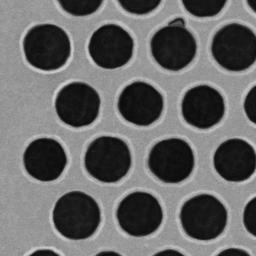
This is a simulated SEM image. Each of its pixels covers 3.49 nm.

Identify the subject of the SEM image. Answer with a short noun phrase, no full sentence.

a regular array of holes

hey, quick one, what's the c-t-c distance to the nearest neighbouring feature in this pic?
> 218 nm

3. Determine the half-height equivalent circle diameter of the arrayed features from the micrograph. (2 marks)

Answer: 153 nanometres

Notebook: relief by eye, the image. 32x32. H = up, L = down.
HHHHHHHHLLLLHHHLLLLLHHHLLLLLHHHL
HHHHHHHHHLLLHHHHHLHHHHHHLLLHHHHH
HHHHHHHHHHHHHHHHHHHHHHHHHHHHHHHH
HHHHLLLHHHHHHLLHHHHHLLLHHHHHLLLH
HHHLLLLLHHHLLLLLHHHLLLLLHHHLLLLL
HHHLLLLLLHHLLLLLLHHLLLLLHHHLLLLL
HHHLLLLLLHHLLLLLHHHLLLLLHHHLLLLL
HHHHLLLLHHHHLLLLHHHHLLLLHHHLLLLL
HHHHHLLHHHHHHLHHHHHHHLLHHHHHLLLH
HHHHHHHHHHHHHHHHHHHHHHHHHHHHHHHH
HHHHHHHHHLHHHHHHHLHHHHHHHHHHHHHH
HHHHHHHHLLLLHHHLLLLLHHHHLLLHHHHL
HHHHHHHLLLLLHHHLLLLLHHHLLLLLHHHL
HHHHHHHLLLLLHHHLLLLLHHHLLLLLHHHL
HHHHHHHLLLLLHHHLLLLLHHHLLLLLHHHL
HHHHHHHHLLLHHHHHHLLHHHHHLLLHHHHH
HHHHHHHHHHHHHHHHHHHHHHHHHHHHHHHH
HHHHHLLHHHHHLLLHHHHHHLLHHHHHHLHH
HHHLLLLLHHHLLLLLHHHLLLLLHHHLLLLH
HHHLLLLLHHHLLLLLHHHLLLLLHHHLLLLL
HHHLLLLLHHHLLLLLHHHLLLLLHHHLLLLL
HHHHLLLLHHHLLLLLHHHLLLLLHHHLLLLL
HHHHHLLHHHHHLLLHHHHHLLLHHHHHLLHH
HHHHHHHHHHHHHHHHHHHHHHHHHHHHHHHH
HHHHHHHHLLLHHHHHLLLHHHHHHLHHHHHH
HHHHHHHLLLLLHHHLLLLLHHHLLLLLHHHL
HHHHHHHLLLLLHHHLLLLLHHHLLLLLHHHL
HHHHHHHLLLLLHHHLLLLLHHHLLLLLHHLL
HHHHHHHLLLLLHHHLLLLLHHHLLLLLHHHL
HHHHHHHHLLLHHHHHHHHHHHHHLLLHHHHH
HHHHHHHHHHHHHHHHHHHHHHHHHHHHHHHH
HHHHLLLHHHHHHLHHHHHHLLHHHHHHLLHH